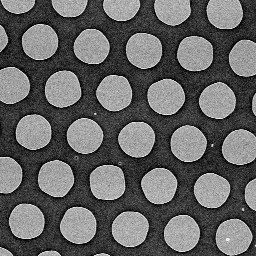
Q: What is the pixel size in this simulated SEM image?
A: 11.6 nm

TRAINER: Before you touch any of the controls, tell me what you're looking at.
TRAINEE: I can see an array of small figures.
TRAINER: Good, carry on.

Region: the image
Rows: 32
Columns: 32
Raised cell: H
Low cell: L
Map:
HHHHLLLHHHHLLHHHHLLHHHHHLLHHHHLL
LHHLLLLHHHLLLHHHHLLHHHHHLLHHHHLL
LLLLLLLLLLLLLLHHLLLLHHHLLLHHHHLL
LLLLHHLLLLLLLLLLLLLLLLLLLLLHHLLL
HLLHHHHLLLHHHLLLLHHLLLLLLLLLLLLL
HLLHHHHLLHHHHHLLHHHHLLLHHHLLLLHH
LLLHHHHLLHHHHHLLHHHHLLHHHHHLLHHH
LLLLLLLLLLHHHLLLHHHHLLHHHHHLLHHH
LHLLLLLLLLLLLLLLLLHLLLLHHHLLLHHH
HHHLLLHHHLLLLLHLLLLLLLLLLLLLLLHL
HHHHLLHHHHLLLHHHLLLHHHLLLLLHLLLL
HHHHLLHHHHLLHHHHLLLHHHHLLHHHHLLL
HHHLLLHHHHLLHHHHLLLHHHHLLHHHHLLL
LLLLLLLLLLLLLHHLLLLHHHLLLHHHHLLL
LLLHHLLLLLLLLLLLLLLLLLLLLLHHLLLL
LLHHHHLLLHHHLLLLHHLLLLLLLLLLLLLL
LLHHHHLLHHHHHLLHHHHLLLHHHLLLLHHL
LLHHHHLLHHHHHLLHHHHLLHHHHHLLHHHH
LLLHHLLLLHHHLLLHHHHLLHHHHHLLHHHH
LLLLLLLLLLLLLLLLHHLLLLHHHLLLHHHH
HHLLLLHHLLLLLLLLLLLLLLLLLLLLLHHL
HHHLLHHHHLLLHHHLLLLHHLLLLLLLLLLL
HHHLLHHHHLLHHHHHLLHHHHLLLHHHLLLL
HHLLLHHHHLLHHHHHLLHHHHLLHHHHHLLH
LLLLLLLHLLLLHHHLLLHHHHLLHHHHLLLH
LLLLLLLLLLLLLLLLLLLLLLLLLHHHLLLH
LLHHHLLLHHHLLLLLHLLLLLLLLLLLLLLL
LHHHHLLLHHHHLLHHHHLLLHHHLLLLLHLL
LHHHHLLLHHHHLLHHHHHLLHHHHLLHHHHL
LLHHHLLLHHHHLLHHHHLLLHHHHLLHHHHL
LLLLLLLLLLLLLLLHHLLLLHHHHLLHHHHL
HLLLLLHLLLLLLLLLLLLLLLLLLLLLHHLL